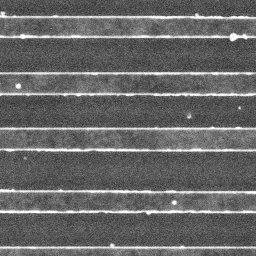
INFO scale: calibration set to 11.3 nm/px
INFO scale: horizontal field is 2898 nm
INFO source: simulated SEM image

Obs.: lines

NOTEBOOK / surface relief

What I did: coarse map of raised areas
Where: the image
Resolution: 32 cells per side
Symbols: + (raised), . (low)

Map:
................................
................................
++++++++++++++++++++++++++++++++
++++++++++++++++++++++++++++++++
++++++++++++++++++++++++++++++++
................................
................................
................................
................................
++++++++++++++++++++++++++++++++
++++++++++++++++++++++++++++++++
++++++++++++++++++++++++++++++++
................................
................................
................................
................................
++++++++++++++++++++++++++++++++
++++++++++++++++++++++++++++++++
++++++++++++++++++++++++++++++++
................................
................................
................................
................................
................................
++++++++++++++++++++++++++++++++
++++++++++++++++++++++++++++++++
++++++++++++++++++++++++++++++++
................................
................................
................................
................................
++++++++++++++++++++++++++++++++